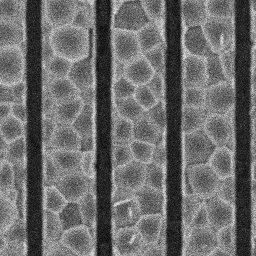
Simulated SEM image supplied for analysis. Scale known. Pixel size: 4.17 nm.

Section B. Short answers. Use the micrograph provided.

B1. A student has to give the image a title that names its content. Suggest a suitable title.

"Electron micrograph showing one or a few lines or trenches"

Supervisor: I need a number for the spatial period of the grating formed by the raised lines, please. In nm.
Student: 290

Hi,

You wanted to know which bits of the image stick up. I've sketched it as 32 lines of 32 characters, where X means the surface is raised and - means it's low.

XXX--XXXXXXX--XXXXXXX--XXXXXX--X
XXX--XXXXXXX--XXXXXXX--XXXXXX--X
XXX--XXXXXXX--XXXXXXX--XXXXXX--X
XXX--XXXXXXX--XXXXXXX--XXXXXX--X
XXX--XXXXXXX--XXXXXXX--XXXXXX--X
XXX--XXXXXXX--XXXXXXX--XXXXXX--X
XXX--XXXXXXX--XXXXXXX--XXXXXX--X
XXX--XXXXXXX--XXXXXXX--XXXXXX--X
XXX--XXXXXXX--XXXXXXX--XXXXXX--X
XXX--XXXXXXX--XXXXXXX--XXXXXX--X
XXX--XXXXXXX--XXXXXXX--XXXXXX--X
XXX--XXXXXXX--XXXXXXX--XXXXXX--X
XXX--XXXXXXX--XXXXXXX--XXXXXX--X
XXX--XXXXXXX--XXXXXXX--XXXXXX--X
XXX--XXXXXXX--XXXXXXX--XXXXXX--X
XXX--XXXXXXX--XXXXXXX--XXXXXX--X
XXX--XXXXXXX--XXXXXXX--XXXXXX--X
XXX--XXXXXXX--XXXXXXX--XXXXXX--X
XXX--XXXXXXX--XXXXXXX--XXXXXX--X
XXX--XXXXXXX--XXXXXXX--XXXXXX--X
XXX--XXXXXXX--XXXXXXX--XXXXXX--X
XXX--XXXXXXX--XXXXXXX--XXXXXX--X
XXX--XXXXXXX--XXXXXXX--XXXXXX--X
XXX--XXXXXXX--XXXXXXX--XXXXXX--X
XXX--XXXXXXX--XXXXXXX--XXXXXX--X
XXX--XXXXXXX--XXXXXXX--XXXXXX--X
XXX--XXXXXXX--XXXXXXX--XXXXXX--X
XXX--XXXXXXX--XXXXXXX--XXXXXX--X
XXX--XXXXXXX--XXXXXXX--XXXXXX--X
XXX--XXXXXXX--XXXXXXX--XXXXXX--X
XXX--XXXXXXX--XXXXXXX--XXXXXX--X
XXX--XXXXXXX--XXXXXXX--XXXXXX--X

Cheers